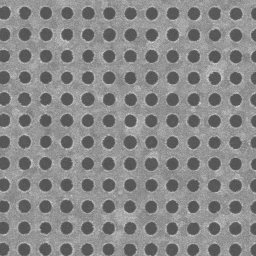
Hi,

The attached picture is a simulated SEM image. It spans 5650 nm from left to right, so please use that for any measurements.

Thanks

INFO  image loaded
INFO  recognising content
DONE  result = a regular array of holes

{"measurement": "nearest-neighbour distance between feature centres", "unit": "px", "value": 20.9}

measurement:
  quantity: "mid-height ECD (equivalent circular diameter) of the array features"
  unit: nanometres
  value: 284